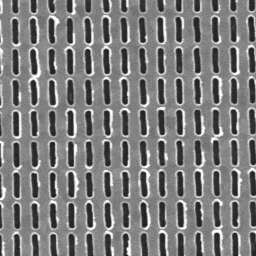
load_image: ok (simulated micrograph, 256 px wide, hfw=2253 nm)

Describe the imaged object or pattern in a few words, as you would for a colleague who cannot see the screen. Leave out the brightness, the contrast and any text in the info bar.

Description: a regular array of holes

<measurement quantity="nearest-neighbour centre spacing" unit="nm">158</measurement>